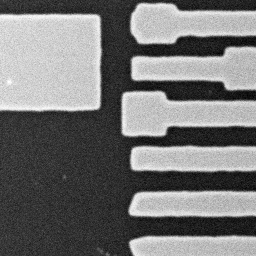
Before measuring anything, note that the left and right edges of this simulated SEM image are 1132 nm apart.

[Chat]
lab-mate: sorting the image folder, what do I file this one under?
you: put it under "wiring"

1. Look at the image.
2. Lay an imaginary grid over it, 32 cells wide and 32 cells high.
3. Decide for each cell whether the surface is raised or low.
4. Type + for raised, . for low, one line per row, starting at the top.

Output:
................................
.................+++++++++++++++
++++++++++++.....+++++++++++++++
++++++++++++....++++++++++++++++
++++++++++++.....++++++..+......
++++++++++++....................
+++++++++++++...............++++
++++++++++++.....+++++++++++++++
++++++++++++.....+++++++++++++++
++++++++++++.....+++++++++++++++
++++++++++++................++++
++++++++++++....................
++++++++++++...++++++...........
++++++++++++...+++++++++++++++++
...............+++++++++++++++++
...............+++++++++++++++++
...............++++++...........
................................
.................+++..+++...++++
.................+++++++++++++++
.................+++++++++++++++
................................
................................
................................
.................+++++++++++++++
................++++++++++++++++
................++++++++++++++++
................................
................................
................................
................++++++++++++++++
.................+++++++++++++++